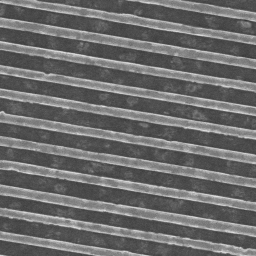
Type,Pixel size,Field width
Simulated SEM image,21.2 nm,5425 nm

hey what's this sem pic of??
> parallel lines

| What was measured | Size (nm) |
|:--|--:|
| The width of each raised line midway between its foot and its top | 170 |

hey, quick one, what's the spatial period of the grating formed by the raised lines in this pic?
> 496 nanometers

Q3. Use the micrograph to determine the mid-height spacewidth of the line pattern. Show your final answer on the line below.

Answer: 337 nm